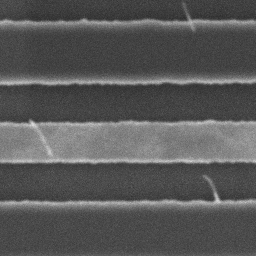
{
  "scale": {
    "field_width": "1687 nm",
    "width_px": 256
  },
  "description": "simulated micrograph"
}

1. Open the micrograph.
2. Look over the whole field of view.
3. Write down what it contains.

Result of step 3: lines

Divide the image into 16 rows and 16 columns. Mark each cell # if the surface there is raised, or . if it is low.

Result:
................
################
################
################
################
................
................
................
################
################
................
................
................
################
################
################